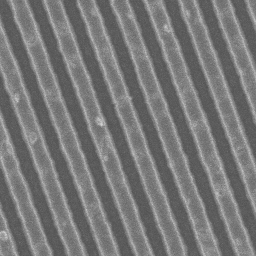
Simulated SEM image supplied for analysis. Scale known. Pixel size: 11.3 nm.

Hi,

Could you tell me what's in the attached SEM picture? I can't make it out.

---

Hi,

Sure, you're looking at parallel lines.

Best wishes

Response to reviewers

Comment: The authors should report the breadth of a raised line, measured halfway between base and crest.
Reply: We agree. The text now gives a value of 191 nanometres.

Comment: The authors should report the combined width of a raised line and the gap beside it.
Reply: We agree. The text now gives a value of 360 nm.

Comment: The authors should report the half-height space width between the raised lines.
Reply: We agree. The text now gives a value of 172 nanometers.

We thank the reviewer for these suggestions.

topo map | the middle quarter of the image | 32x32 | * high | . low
.****....****.....****....****..
.****.....****....****....*****.
.*****....****....*****....****.
..****....*****....****....****.
..*****....****....*****...*****
...****....****....*****....****
...****....*****....****....****
...*****....****....****.....***
....****....*****....****....***
....****....*****....****....***
....*****....****....*****....**
*....****....****....*****....**
*....****....*****....****....**
**...*****....****....*****....*
**....****....*****....****....*
**....*****....****....*****...*
**....*****....****....*****....
***....****....*****....****....
***....*****....****....*****...
****....****....*****...*****...
****....****....*****....****...
****.....****....****....****...
*****....****....****....*****..
.****....*****....****....****..
.*****....****....****....*****.
.*****....****....*****...*****.
..****....****.....****....****.
..*****...*****....****....*****
...****....****....*****....****
...****....****.....****....****
...****.....****....****.....***
....****....****....*****....***